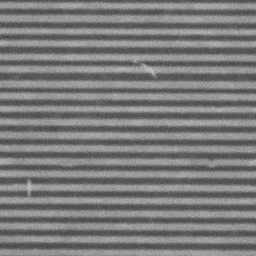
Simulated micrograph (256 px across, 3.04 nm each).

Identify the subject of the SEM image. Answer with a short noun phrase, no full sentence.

parallel lines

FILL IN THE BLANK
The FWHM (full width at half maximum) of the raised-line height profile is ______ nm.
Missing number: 15.9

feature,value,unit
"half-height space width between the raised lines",23.9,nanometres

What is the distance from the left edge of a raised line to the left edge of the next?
0.0394 micrometres